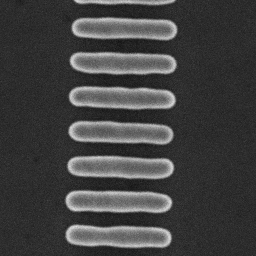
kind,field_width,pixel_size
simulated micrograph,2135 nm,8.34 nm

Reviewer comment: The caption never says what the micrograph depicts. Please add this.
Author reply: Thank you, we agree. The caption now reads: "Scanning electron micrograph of groups of lines, slits or small figures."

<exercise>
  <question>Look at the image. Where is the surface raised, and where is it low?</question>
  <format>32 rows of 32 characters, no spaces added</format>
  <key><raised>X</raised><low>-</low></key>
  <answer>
------------------XX------------
--------------------------------
----------XXXXXXXXX-------------
---------XXXXXXXXXXXXX----------
----------XXXXXXXXXXXX----------
--------------------------------
--------------------------------
---------XXXXXXXXXXXXX----------
---------XXXXXXXXXXXXX----------
--------------------------------
--------------------------------
---------XXXXXXXXXXXX-----------
---------XXXXXXXXXXXXX----------
----------------XX--------------
--------------------------------
---------XXXXXXXXX--------------
---------XXXXXXXXXXXXX----------
----------XXXXXXXXXXX-----------
--------------------------------
--------------------------------
---------XXXXXXXXXXXX-----------
---------XXXXXXXXXXXX-----------
--------------------------------
--------------------------------
---------XXXXXXXXXXXX-----------
--------XXXXXXXXXXXXX-----------
--------------------------------
--------------------------------
---------XXXXXXXXX--------------
--------XXXXXXXXXXXXX-----------
---------XXXXXXXXXXXX-----------
--------------------------------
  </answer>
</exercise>